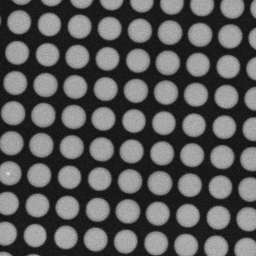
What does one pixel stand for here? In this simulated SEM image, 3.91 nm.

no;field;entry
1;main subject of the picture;an array of small figures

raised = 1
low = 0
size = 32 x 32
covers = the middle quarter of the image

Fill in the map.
00111000011110001111100111111001
00000000001100000111000111110001
00000000000000000000000001100000
01111000011000000000000000000000
11111000111110001111000011100000
11111100111110011111100111110001
11111100111110011111100111110011
11111000111110011111100111110011
00110000111100001111000111110011
00000000000000000110000011100001
01110000000000000000000000000000
11111000111100000100000000000000
11111001111100011111000111100000
11111001111110011111001111100011
11111001111110011111001111110011
11110000111100011111001111110011
00000000010000001110000111100011
00000000000000000000000011000001
11110000010000000000000000000000
11111001111100011110000000000000
11111001111100111111001111100011
11111011111100111111001111100111
11110001111100111111001111100111
01100001111100011110001111100111
00000000000000001100001111100011
00000000000000000000000000000001
11110001111000001000000000000000
11110011111100111110001111000001
11110011111100111110011111100111
11110011111100111110011111100111
11100001111000111110011111100111
00000000000000111100011111000111